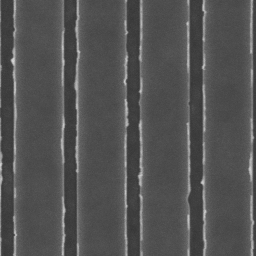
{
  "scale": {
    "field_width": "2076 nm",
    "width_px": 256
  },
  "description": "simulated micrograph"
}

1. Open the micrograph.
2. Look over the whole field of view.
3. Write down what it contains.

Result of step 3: parallel lines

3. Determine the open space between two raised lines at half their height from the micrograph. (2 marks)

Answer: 106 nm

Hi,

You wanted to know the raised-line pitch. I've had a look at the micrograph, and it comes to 510 nm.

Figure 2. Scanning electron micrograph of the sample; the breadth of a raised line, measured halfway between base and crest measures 0.404 µm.